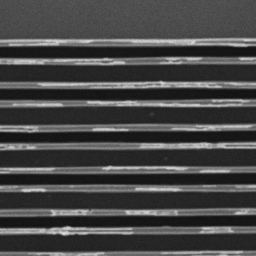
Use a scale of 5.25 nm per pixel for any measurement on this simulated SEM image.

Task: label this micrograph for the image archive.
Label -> parallel lines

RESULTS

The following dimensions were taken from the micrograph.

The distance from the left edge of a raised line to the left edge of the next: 20.8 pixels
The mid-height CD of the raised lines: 32.8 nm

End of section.